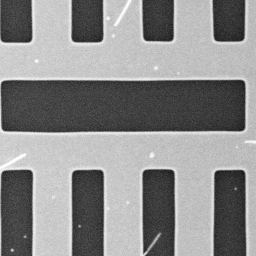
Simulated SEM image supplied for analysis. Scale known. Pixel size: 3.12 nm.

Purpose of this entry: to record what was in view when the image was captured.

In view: groups of lines, slits or small figures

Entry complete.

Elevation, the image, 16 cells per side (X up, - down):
--XX---XX--XX--X
--XX---XX--XX--X
--XXX-XXX--XXX-X
XXXXXXXXXXXXXXXX
XXXXXXXXXXXXXXXX
---------------X
---------------X
---------------X
XXXXXXXXXXXXXXXX
XXXXXXXXXXXXXXXX
XXXXXXXXXXXXXXXX
--XX---XX--XX--X
--XX---XX--XX--X
--XX---XX--XX--X
--XX---XX--XX--X
--XX---XX--XX--X